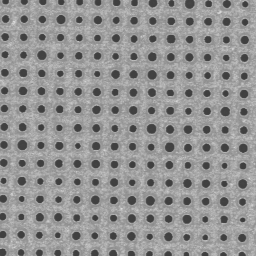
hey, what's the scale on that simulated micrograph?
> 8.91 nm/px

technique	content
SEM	a regular array of holes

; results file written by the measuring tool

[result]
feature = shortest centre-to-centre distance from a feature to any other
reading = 158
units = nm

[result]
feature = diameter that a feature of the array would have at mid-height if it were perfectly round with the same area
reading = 0.0675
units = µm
